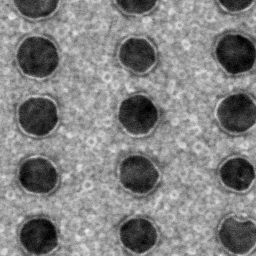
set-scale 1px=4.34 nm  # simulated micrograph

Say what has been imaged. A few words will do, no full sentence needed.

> raised bodies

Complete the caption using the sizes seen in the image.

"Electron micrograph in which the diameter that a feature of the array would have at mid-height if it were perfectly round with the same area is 0.178 micrometres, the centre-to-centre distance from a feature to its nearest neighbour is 258 nanometres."